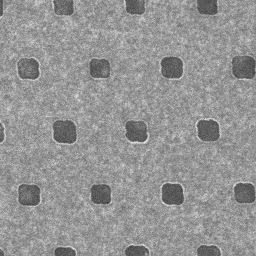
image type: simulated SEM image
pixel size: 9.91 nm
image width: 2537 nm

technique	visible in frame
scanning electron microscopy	a regular array of holes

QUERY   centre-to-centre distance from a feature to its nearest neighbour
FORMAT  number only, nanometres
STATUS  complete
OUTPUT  709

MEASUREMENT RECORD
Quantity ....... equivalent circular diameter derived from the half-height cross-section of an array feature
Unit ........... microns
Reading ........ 0.236